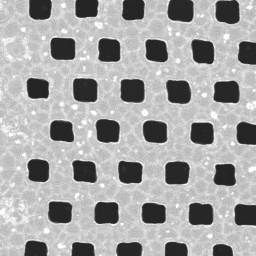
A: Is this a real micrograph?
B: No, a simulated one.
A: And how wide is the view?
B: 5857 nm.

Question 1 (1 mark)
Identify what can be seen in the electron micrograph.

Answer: a regular array of holes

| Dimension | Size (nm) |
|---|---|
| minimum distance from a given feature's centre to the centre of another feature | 1060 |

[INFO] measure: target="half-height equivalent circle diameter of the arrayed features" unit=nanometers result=568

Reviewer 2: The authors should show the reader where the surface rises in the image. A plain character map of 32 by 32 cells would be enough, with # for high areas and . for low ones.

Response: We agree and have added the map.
####..###...###...###...###...##
####..###...###...###...###...##
################.#####..###...##
################################
################################
######...###...###...###...###..
######...###...###...###...###..
#######.#####..####..###...###..
################################
################################
###...###...###...###..####...##
###...###...###...###...###...##
##########..###...###...###...##
################################
################################
######...###...###...###..####..
######...###...###...###...###..
#######..###...###...###...###..
################################
################################
###...###...###..####..#####.###
####..###...###...###...###..###
####..###...###...###..####..###
################################
################################
######...###...###.#####.#######
######...###...###...###...##...
######...###...###...###...##...
################################
################################
###...###..####...###..####.####
###...###...###...###..####..###